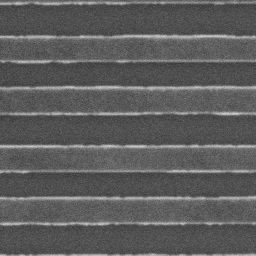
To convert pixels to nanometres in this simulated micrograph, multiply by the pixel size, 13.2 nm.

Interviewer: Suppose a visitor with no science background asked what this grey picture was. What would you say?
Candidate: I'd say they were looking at lines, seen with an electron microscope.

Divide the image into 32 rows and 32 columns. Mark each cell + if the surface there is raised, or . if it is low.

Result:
................................
................................
................................
................................
................................
++++++++++++++++++++++++++++++++
++++++++++++++++++++++++++++++++
++++++++++++++++++++++++++++++++
................................
................................
................................
++++++++++++++++++++++++++++++++
++++++++++++++++++++++++++++++++
++++++++++++++++++++++++++++++++
................................
................................
................................
................................
++++++++++++++++++++++++++++++++
++++++++++++++++++++++++++++++++
++++++++++++++++++++++++++++++++
++++............................
................................
................................
................................
++++++++++++++++++++++++++++++++
++++++++++++++++++++++++++++++++
++++++++++++++++++++++++++++++++
................................
................................
................................
................................